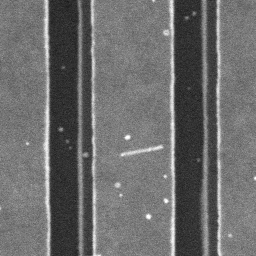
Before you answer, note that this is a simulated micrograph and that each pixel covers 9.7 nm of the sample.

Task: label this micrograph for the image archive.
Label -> lines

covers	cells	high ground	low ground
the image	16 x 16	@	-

@@@---@@@@@---@@
@@@---@@@@@---@@
@@@---@@@@@---@@
@@@---@@@@@---@@
@@@---@@@@@---@@
@@@---@@@@@---@@
@@@---@@@@@---@@
@@@---@@@@@---@@
@@@---@@@@@---@@
@@@---@@@@@---@@
@@@---@@@@@---@@
@@@---@@@@@---@@
@@@---@@@@@---@@
@@@---@@@@@---@@
@@@---@@@@@---@@
@@@---@@@@@---@@